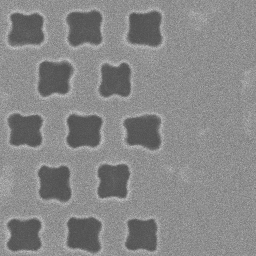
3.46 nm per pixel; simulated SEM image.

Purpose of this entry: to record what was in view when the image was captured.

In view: a regular array of holes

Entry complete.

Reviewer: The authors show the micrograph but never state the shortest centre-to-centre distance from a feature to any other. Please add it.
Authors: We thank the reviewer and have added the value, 201 nm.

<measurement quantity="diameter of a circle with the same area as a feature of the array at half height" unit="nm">122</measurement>